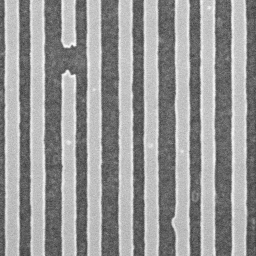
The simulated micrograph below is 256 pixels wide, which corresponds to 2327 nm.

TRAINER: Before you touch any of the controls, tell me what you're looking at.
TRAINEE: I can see parallel lines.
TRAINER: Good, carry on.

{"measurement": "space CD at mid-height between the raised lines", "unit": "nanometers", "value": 122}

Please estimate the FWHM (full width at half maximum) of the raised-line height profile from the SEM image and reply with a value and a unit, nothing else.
13.4 pixels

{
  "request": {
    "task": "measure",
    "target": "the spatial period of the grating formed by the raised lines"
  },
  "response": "258 nanometers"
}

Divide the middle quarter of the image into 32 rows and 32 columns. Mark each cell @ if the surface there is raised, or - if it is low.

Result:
------@@@-----@@@---@@@-----@@@-
------@@@-----@@@---@@@-----@@@-
@-----@@@-----@@@---@@@-----@@@-
@@@---@@@-----@@@---@@@-----@@@-
@@@---@@@-----@@@---@@@-----@@@-
@@@---@@@-----@@@---@@@-----@@@-
@@@---@@@-----@@@---@@@-----@@@-
@@@---@@@-----@@@---@@@-----@@@-
@@@---@@@-----@@@---@@@-----@@@-
@@@---@@@-----@@@---@@@-----@@@-
@@@---@@@-----@@@---@@@-----@@@-
@@@---@@@-----@@@---@@@-----@@@-
@@@---@@@-----@@@---@@@-----@@@-
@@@---@@@-----@@@---@@@-----@@@-
@@@---@@@-----@@@---@@@-----@@@-
@@@---@@@-----@@@---@@@-----@@@-
@@@---@@@-----@@@---@@@-----@@@-
@@@---@@@-----@@@---@@@-----@@@-
@@@---@@@-----@@@---@@@-----@@@-
@@@---@@@-----@@@---@@@-----@@@-
@@@---@@@-----@@@---@@@-----@@@-
@@@---@@@-----@@@---@@@-----@@@-
@@@---@@@-----@@@---@@@-----@@@-
@@@---@@@-----@@@---@@@-----@@@-
@@@---@@@-----@@@---@@@-----@@@-
@@@---@@@-----@@@---@@@-----@@@-
@@@---@@@-----@@@---@@@-----@@@-
@@@---@@@-----@@@---@@@-----@@@-
@@@---@@@-----@@@---@@@-----@@@-
@@@---@@@-----@@@---@@@-----@@@-
@@@---@@@-----@@@---@@@-----@@@-
@@@---@@@-----@@@---@@@-----@@@-